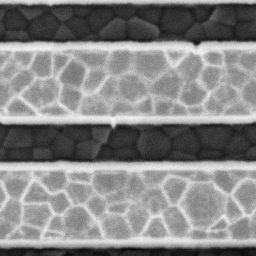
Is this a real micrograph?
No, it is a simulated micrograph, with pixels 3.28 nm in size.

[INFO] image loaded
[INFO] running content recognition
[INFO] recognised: one or a few lines or trenches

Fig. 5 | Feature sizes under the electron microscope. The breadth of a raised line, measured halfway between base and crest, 253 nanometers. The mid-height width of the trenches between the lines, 146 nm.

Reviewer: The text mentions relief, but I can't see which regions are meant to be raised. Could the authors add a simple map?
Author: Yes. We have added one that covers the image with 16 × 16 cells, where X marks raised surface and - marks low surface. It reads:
----------------
----------------
----------------
XXXXXXXXXXXXXXXX
XXXXXXXXXXXXXXXX
XXXXXXXXXXXXXXXX
XXXXXXXXXXXXXXXX
XXXXXXXXXXXXXXXX
----------------
----------------
XXXXXXXXXXXXXXXX
XXXXXXXXXXXXXXXX
XXXXXXXXXXXXXXXX
XXXXXXXXXXXXXXXX
XXXXXXXXXXXXXXXX
----------------